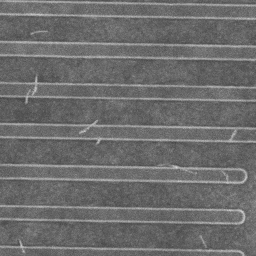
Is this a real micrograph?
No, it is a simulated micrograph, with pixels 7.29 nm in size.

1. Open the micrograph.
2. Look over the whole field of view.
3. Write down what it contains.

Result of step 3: parallel lines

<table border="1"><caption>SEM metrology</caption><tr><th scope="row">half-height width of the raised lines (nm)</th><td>100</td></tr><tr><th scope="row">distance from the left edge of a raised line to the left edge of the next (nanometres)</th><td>298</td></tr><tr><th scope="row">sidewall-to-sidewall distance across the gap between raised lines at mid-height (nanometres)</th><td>194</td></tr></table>